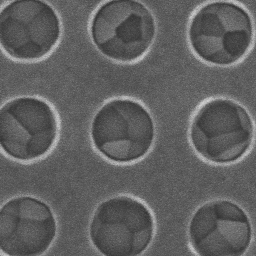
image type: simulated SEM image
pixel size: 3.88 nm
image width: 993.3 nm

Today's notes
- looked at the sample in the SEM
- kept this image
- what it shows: holes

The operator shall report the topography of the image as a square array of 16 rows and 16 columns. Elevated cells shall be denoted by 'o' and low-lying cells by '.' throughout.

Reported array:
...ooo...oooo..o
....oo....oo....
....oo....oo....
o..oooo..oooo..o
oooooooooooooooo
oooooooooooooooo
...oooo..oooo..o
...ooo...ooo....
...ooo....oo....
...ooo...ooo...o
oooooooooooooooo
oooooooooooooooo
o.ooooo.oooooooo
...ooo...ooo...o
...ooo....oo...o
...ooo...ooo...o